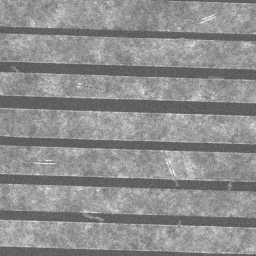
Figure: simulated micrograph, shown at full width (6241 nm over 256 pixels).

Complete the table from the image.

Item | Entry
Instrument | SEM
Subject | parallel lines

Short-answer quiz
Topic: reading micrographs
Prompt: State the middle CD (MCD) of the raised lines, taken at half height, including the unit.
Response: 0.673 microns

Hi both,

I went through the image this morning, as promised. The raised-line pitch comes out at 903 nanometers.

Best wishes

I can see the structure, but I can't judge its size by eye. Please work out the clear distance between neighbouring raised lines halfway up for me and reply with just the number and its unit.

241 nanometers